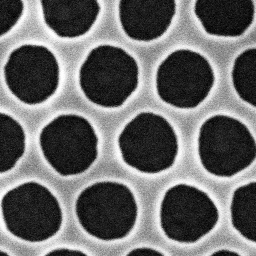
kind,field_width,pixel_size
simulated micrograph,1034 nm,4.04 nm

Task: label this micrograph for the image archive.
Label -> holes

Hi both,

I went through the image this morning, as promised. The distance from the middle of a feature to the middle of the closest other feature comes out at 307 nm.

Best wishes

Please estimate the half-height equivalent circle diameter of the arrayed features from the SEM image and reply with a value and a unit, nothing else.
0.244 micrometres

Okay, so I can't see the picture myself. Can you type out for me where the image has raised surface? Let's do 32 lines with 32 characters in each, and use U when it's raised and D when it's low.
DDDUUDDDDDDDUUUDDDDDDDUUDDDDDDDD
DDDUUDDDDDDDUUUDDDDDDDUUDDDDDDDD
DDUUUDDDDDDDUUUDDDDDDDUUUDDDDDDD
DDUUUUDDDDDUUUUDDDDDDUUUUDDDDDDU
UUUUUUUDDDUUUUUUDDDDUUUUUUUDDDUU
UUUDUUUUUUUUUUUUUUUUUUUUUUUUUUUU
UDDDDDUUUUUDDDDDUUUUUUDDUUUUUUDD
UDDDDDDUUUUDDDDDDUUUDDDDDDUUUDDD
DDDDDDDUUUDDDDDDDUUUDDDDDDDUUDDD
DDDDDDDUUUDDDDDDDUUDDDDDDDDUUDDD
UDDDDDDUUUDDDDDDDUUUDDDDDDDUUDDD
UDDDDDDUUUDDDDDDDUUUDDDDDDUUUUDD
UUDDDDUUUUUDDDDDUUUUDDDDDDUUUUDD
UUUUUUUUUUUUUUUUUUUUUUDDUUUUUUUU
DUUUUUUDDDUUUUUUUDDDUUUUUUDDDUUU
DDDUUUDDDDDUUUUUDDDDDUUUUDDDDDDU
DDDUUDDDDDDDUUUDDDDDDDUUUDDDDDDU
DDDUUDDDDDDDUUUDDDDDDDUUUDDDDDDD
DDDUUDDDDDDDUUUDDDDDDDUUUDDDDDDD
DDDUUUDDDDDDUUUDDDDDDDUUUDDDDDDD
DDUUUUDDDDDDUUUUDDDDDDUUUDDDDDDU
DUUUUUUDDDUUUUUUUUDDUUUUUUDDDDUU
UUUUUUUUUUUUUUUUUUUUUUUUUUUUUUUU
UUDDDDUUUUUDDDDDUUUUUDDDDUUUUUDD
DDDDDDDUUUDDDDDDDUUUDDDDDDUUUDDD
DDDDDDDUUDDDDDDDDUUUDDDDDDDUUDDD
DDDDDDDDUDDDDDDDDUUUDDDDDDDUUDDD
DDDDDDDDUUDDDDDDDUUUDDDDDDDUUDDD
UDDDDDDDUUDDDDDDDUUUDDDDDDDUUDDD
UUDDDDDUUUUDDDDDUUUUUDDDDUUUUUDD
UUUUUUUUUUUUUUUUUUUUUUUUUUUUUUUU
DUUUUUDDDDUUUUUUDDDDUUUUUUUDDUUU